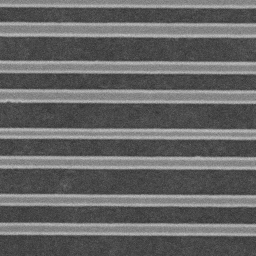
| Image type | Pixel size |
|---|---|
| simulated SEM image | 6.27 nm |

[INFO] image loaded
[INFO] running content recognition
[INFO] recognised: parallel lines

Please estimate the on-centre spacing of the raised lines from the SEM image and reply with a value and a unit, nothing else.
0.209 microns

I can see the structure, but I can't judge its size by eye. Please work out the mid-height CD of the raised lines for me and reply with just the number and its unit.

68.2 nanometers